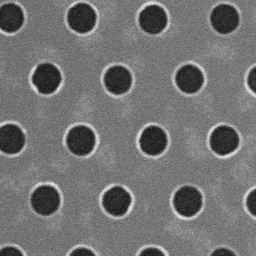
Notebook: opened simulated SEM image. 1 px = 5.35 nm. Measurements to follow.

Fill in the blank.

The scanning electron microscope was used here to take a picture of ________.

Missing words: a regular array of holes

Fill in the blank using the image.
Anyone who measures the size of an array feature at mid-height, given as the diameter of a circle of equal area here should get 160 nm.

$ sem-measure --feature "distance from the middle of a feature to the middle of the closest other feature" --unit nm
374